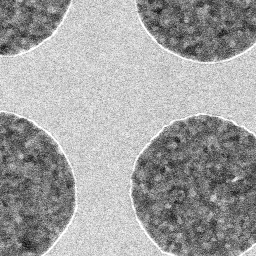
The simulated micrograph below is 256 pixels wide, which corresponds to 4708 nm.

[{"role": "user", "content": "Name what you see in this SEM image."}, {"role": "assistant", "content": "raised bodies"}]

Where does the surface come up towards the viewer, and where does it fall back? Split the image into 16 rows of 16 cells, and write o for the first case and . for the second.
oooo.....ooooooo
oooo.....ooooooo
ooo.......oooooo
...........oooo.
................
................
................
oo.........ooo..
ooo.......oooooo
oooo.....ooooooo
oooo....oooooooo
ooooo...oooooooo
ooooo...oooooooo
ooooo....ooooooo
oooo.....ooooooo
ooo.......oooooo